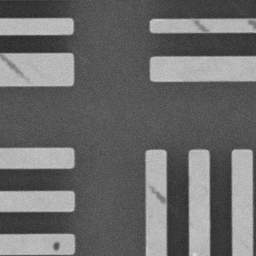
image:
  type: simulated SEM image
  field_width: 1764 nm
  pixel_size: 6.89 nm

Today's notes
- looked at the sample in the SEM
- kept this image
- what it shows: groups of lines, slits or small figures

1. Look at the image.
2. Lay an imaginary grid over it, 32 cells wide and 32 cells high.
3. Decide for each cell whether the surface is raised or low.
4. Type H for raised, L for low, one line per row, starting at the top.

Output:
LLLLLLLLLLLLLLLLLLLLLLLLLLLLLLLL
LLLLLLLLLLLLLLLLLLLLLLLLLLLLLLLL
HHHHHHHHHLLLLLLLLLLHHHHHHHHHHHHH
HHHHHHHHHLLLLLLLLLLHHHHHHHHHHHHH
LLLLLLLLLLLLLLLLLLLLLLLLLLLLLLLL
LLLLLLLLLLLLLLLLLLLLLLLLLLLLLLLL
LLLLLLLLLLLLLLLLLLLLLLLLLLLLLLLL
HHHHHHHHHLLLLLLLLLLHHHHHHHHHHHHH
HHHHHHHHHLLLLLLLLLLHHHHHHHHHHHHH
HHHHHHHHHLLLLLLLLLLHHHHHHHHHHHHH
HHHHHHHHHLLLLLLLLLLLLLLLLLLLLLLL
LLLLLLLLLLLLLLLLLLLLLLLLLLLLLLLL
LLLLLLLLLLLLLLLLLLLLLLLLLLLLLLLL
LLLLLLLLLLLLLLLLLLLLLLLLLLLLLLLL
LLLLLLLLLLLLLLLLLLLLLLLLLLLLLLLL
LLLLLLLLLLLLLLLLLLLLLLLLLLLLLLLL
LLLLLLLLLLLLLLLLLLLLLLLLLLLLLLLL
LLLLLLLLLLLLLLLLLLLLLLLLLLLLLLLL
LLLLLLLLLLLLLLLLLLLLLLLLLLLLLLLL
HHHHHHHHHLLLLLLLLLHHHLLLHHLLLHHL
HHHHHHHHHLLLLLLLLLHHHLLLHHLLLHHL
LLLLLLLLLLLLLLLLLLHHHLLLHHLLLHHH
LLLLLLLLLLLLLLLLLLHHHLLLHHLLLHHH
LLLLLLLLLLLLLLLLLLHHHLLLHHLLLHHH
HHHHHHHHHLLLLLLLLLHHHLLLHHLLLHHH
HHHHHHHHHLLLLLLLLLHHHLLLHHLLLHHH
LLLLLLLLLLLLLLLLLLHHHLLLHHLLLHHH
LLLLLLLLLLLLLLLLLLHHHLLLHHLLLHHH
LLLLLLLLLLLLLLLLLLHHHLLLHHLLLHHH
HHHHHHHHHLLLLLLLLLHHHLLLHHLLLHHH
HHHHHHHHHLLLLLLLLLHHHLLLHHLLLHHH
HHHHHHHHHLLLLLLLLLHHHLLLHHLLLHHH